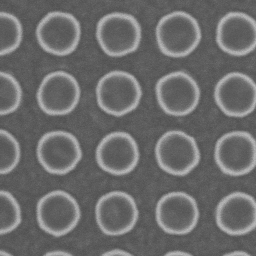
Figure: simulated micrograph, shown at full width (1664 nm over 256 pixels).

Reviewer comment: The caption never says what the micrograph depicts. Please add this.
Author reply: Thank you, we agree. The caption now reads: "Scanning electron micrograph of a regular array of raised bodies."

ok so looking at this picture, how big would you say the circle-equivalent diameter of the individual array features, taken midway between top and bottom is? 265 nanometres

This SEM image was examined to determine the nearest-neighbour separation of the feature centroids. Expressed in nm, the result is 384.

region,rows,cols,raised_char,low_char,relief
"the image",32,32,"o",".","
................................
................................
oo....ooo....oooo...oooo....ooo.
oo...ooooo..ooooo...ooooo..ooooo
oo...ooooo..ooooo...ooooo..ooooo
oo...oooo....oooo...ooooo..ooooo
o......oo....ooo.....ooo.....oo.
................................
................................
o.....oo.....ooo.....oo.....oo..
oo...oooo...ooooo...oooo...ooooo
oo...ooooo..ooooo...ooooo..ooooo
oo...ooooo..ooooo...ooooo..ooooo
oo...oooo....oooo....ooo....oooo
................................
................................
o...............................
oo...oooo....ooo....oooo....oooo
oo...ooooo..ooooo...oooo...ooooo
oo...ooooo..ooooo...ooooo..ooooo
oo...oooo....oooo...oooo...ooooo
o......o......o......oo.....ooo.
................................
................................
o.....oo.....ooo.....oo......oo.
oo...oooo...ooooo...oooo....oooo
oo...ooooo..ooooo...ooooo..ooooo
oo...ooooo..ooooo...ooooo..ooooo
o.....ooo....ooo....oooo....ooo.
................................
................................
................................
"